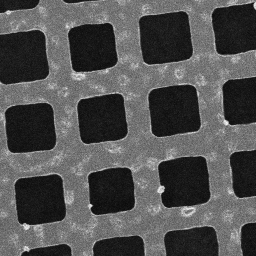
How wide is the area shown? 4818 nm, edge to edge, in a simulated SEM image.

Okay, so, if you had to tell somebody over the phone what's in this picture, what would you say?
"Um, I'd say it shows a regular array of holes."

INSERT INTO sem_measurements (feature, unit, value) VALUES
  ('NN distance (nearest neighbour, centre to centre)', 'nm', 1360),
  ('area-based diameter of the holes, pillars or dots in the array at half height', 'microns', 1.01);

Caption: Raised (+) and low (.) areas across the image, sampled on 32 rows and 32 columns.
.....+++++++++++++++++++++++++++
.+++++++++++++++++++++.++++.....
+++++++++++++++++.......+++.....
+++++++++.....+++.......+++.....
......++......+++.......+++.....
......+++.....++++......+++.....
......+++......+++......+++....+
......+++......+++.....+++++++++
......+++.....++++++++++++++++++
......++++++++++++++++++++++++++
..++++++++++++++++++++++++++....
+++++++++++++++++++......+++....
++++++++++......+++......+++....
+......+++......+++......+++....
+......+++......+++......+++....
+......+++......+++......++++..+
+......+++......+++.....++++++++
+......+++.....+++++++++++++++++
+......+++++++++++++++++++++++++
+++++++++++++++++++++++++++++...
++++++++++++++++++++......+++...
++++++++++++....++++......+++...
++......+++......+++......+++...
++......+++......+++......+++...
++......+++......+++......++++..
++......+++......+++.....+++++++
++......++++...+++++++++++++++++
++......++++++++++++++++++++++++
++++++++++++++++++++++++...+++..
++++++++++++++++.++++......+++..
++++++++++++......+++......+++..
+++......+++......+++......+++..